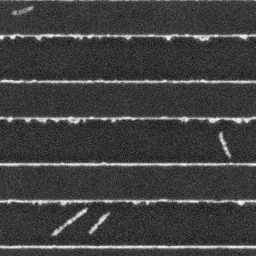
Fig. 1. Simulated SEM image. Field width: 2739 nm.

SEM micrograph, lines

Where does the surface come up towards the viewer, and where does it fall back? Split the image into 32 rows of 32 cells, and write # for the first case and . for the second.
################################
################################
################################
################################
..............#.....#...#.......
................................
................................
................................
................................
................................
################################
################################
################################
################################
################################
................................
................................
................................
................................
................................
............#...................
################################
################################
################################
################################
................................
................................
................................
................................
................................
................................
################################